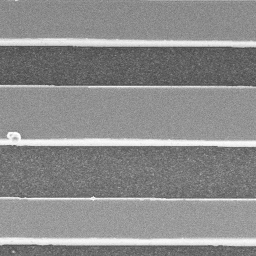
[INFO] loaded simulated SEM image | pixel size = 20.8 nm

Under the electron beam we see lines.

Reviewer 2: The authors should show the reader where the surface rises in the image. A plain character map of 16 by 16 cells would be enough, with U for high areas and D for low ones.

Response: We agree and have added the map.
UUUUUUUUUUUUUUUU
UUUUUUUUUUUUUUUU
UUUUUUUUUUUUUUUU
DDDDDDDDDDDDDDDD
DDDDDDDDDDDDDDDD
UUUUUUUUUUUUUUUU
UUUUUUUUUUUUUUUU
UUUUUUUUUUUUUUUU
UUUUUUUUUUUUUUUU
DDDDDDDDDDDDDDDD
DDDDDDDDDDDDDDDD
DDDDDDDDDDDDDDDD
UUUUUUUUUUUUUUUU
UUUUUUUUUUUUUUUU
UUUUUUUUUUUUUUUU
DDDDDDDDDDDDDDDD